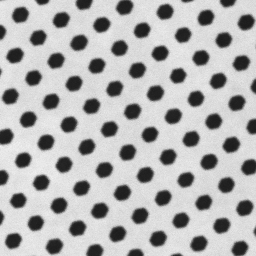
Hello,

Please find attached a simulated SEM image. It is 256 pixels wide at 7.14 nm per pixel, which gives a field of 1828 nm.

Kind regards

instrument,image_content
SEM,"a regular array of holes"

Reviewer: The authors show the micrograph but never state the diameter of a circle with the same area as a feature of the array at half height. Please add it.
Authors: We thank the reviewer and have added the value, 117 nanometres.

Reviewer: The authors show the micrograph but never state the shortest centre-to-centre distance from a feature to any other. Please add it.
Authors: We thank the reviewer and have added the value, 205 nanometres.